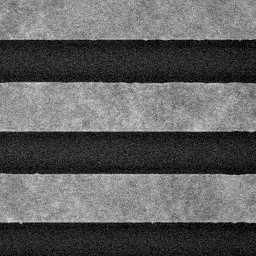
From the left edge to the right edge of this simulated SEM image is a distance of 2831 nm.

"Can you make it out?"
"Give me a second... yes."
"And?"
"lines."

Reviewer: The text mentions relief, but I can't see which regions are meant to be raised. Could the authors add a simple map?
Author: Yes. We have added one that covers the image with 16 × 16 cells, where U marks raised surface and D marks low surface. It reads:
UUUUUUUUUUUUUUUU
UUUUUUUUUUUUUUUU
DDDDDDDDDDDDDDDD
DDDDDDDDDDDDDDDD
DDDDDDDDDDDDDDDD
UUUUUUUUUUUUUUUU
UUUUUUUUUUUUUUUU
UUUUUUUUUUUUUUUU
DDDDDDDDDDDDDDDD
DDDDDDDDDDDDDDDD
DDDDDDDDDDDDDDDD
UUUUUUUUUUUUUUUU
UUUUUUUUUUUUUUUU
UUUUUUUUUUUUUUUU
DDDDDDDDDDDDDDDD
DDDDDDDDDDDDDDDD